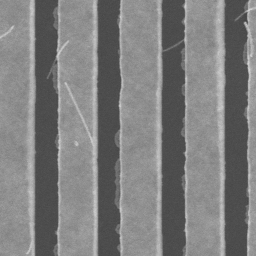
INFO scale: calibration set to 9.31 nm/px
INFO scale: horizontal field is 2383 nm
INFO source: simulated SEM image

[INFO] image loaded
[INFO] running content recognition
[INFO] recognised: lines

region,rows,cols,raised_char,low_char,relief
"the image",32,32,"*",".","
****...*****...*****...*****...*
****...*****...*****...*****...*
****...*****...*****...*****...*
****...*****...*****...*****...*
****...*****...*****...*****...*
****...*****...*****...*****...*
****...*****...*****...*****...*
****...*****...*****...*****...*
****...*****...*****...*****...*
****...*****...*****...*****...*
****...*****...*****...*****...*
****...*****...*****...*****...*
****...*****...*****...*****...*
****...*****...*****...*****...*
****...*****...*****...*****...*
****...*****...*****...*****...*
****...*****...*****...*****...*
****...*****...*****...*****...*
****...*****...*****...*****...*
****...*****...*****...*****...*
****...*****...*****...*****...*
****...*****...*****...*****...*
****...*****...*****...*****...*
****...*****...*****...*****...*
****...*****...*****...*****...*
****...*****...*****...*****...*
****...*****...*****...*****...*
****...*****...*****...*****...*
****...*****...*****...*****...*
****...*****...*****...*****...*
****...*****...*****...*****...*
****...*****...*****...*****...*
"